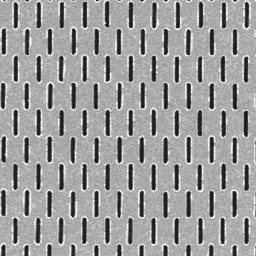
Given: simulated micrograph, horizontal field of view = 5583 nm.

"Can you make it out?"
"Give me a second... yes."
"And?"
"a regular array of holes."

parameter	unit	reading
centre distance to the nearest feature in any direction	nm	502